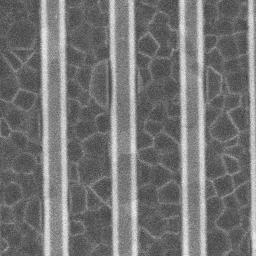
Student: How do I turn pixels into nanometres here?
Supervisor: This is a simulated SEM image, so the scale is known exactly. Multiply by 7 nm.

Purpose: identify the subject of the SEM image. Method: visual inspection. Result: one or a few lines or trenches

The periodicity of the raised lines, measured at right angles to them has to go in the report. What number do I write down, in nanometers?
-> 483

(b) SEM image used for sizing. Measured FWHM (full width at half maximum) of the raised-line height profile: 0.136 micrometres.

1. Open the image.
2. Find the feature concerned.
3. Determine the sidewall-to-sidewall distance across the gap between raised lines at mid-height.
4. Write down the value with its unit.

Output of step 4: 351 nanometres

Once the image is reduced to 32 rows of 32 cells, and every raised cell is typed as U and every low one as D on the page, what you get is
DDDDDUUUDDDDDDUUUDDDDDDUUDDDDDDU
DDDDDUUUDDDDDDUUUDDDDDDUUDDDDDDU
DDDDDUUUDDDDDDUUUDDDDDDUUDDDDDDU
DDDDDUUUDDDDDDUUUDDDDDDUUDDDDDDU
DDDDDUUUDDDDDDUUUDDDDDDUUDDDDDDU
DDDDDUUUDDDDDDUUUDDDDDDUUDDDDDDU
DDDDDUUUDDDDDDUUUDDDDDDUUDDDDDDU
DDDDDUUUDDDDDDUUUDDDDDDUUDDDDDDU
DDDDDUUUDDDDDDUUUDDDDDDUUDDDDDDU
DDDDDDUUDDDDDDUUUDDDDDDUUDDDDDDU
DDDDDDUUDDDDUDUUUDDDDDDUUDDDDDDU
DDDDDDUUDDDDDDUUUDDDDDDUUDDDDDDD
DDDDDDUUDDDDDDUUUDDDDDDUUDDDDDDD
DDDDDDUUDDDDDDUUUDDDDDDUUDDDDDDD
DDDDDDUUDDDDDDUUUDDDDDDUUDDDDDDD
DDDDDDUUDDDDDDUUUDDDDDDUUDDDDDDD
DDDDDDUUDDDDDDUUUDDDDDDUUDDDDDDD
DDDDDDUUDDDDDDUUUDDDDDDUUDDDDDDD
DDDDDDUUDDDDDDUUUDDDDDDUUDDDDDDD
DDDDDDUUDDDDDDUUUDDDDDDUUDDDDDDD
DDDDDDUUDDDDDDUUUDDDDDDUUDDDDDDD
DDDDDDUUDDDDDDUUUDDDDDDUUDDDDDDD
DDDDDDUUDDDDDDUUUDDDDDDUUDDDDDDD
DDDDDDUUDDDDDDUUUDDDDDDUUDDDDDDD
DDDDDDUUDDDDDDUUUDDDDDDUUDDDDDDD
DDDDDDUUDDDDDDUUUDDDDDDUUDDDDDDD
DDDDDDUUDDDDDDUUUDDDDDDUUDDDDDDD
DDDDDDUUDDDDDDUUUDDDDDDUUDDDDDDD
DDDDDDUUDDDDDDUUUDDDDDDUUDDDDDDD
DDDDDDUUDDDDDDUUUDDDDDDUUDDDDDDD
DDDDDDUUDDDDDDUUUDDDDDDUUDDDDDDD
DDDDDDUUDDDDDDUUUDDDDDDUUDDDDDDD